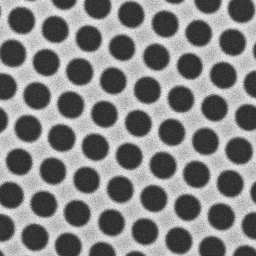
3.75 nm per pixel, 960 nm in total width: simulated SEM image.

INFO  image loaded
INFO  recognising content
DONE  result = a regular array of holes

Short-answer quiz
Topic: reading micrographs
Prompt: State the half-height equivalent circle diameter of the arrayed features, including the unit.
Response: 27.1 px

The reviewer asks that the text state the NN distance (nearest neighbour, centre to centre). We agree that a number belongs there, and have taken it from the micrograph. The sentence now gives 0.128 um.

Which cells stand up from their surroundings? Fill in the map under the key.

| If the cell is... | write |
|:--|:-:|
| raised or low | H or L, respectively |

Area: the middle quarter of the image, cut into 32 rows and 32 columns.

HLLLLLLHHHHHHHHHHHHHHLLLLLHHLLLL
LLLLLLLHHHLLLLHHHHHHHHLLHHHHLLLL
HLLLLLLHHLLLLLLHHHHHHHHHHHHHHLLL
HLLLLLLHHLLLLLLLHHHLLLHHHHHHHHLL
HHLLLLHHHLLLLLLLHHLLLLLLHHHHHHHH
HHHHHHHHHLLLLLLHHHLLLLLLHHHHLLHH
HHHHHHHHHHLLLLLHHLLLLLLLHHHLLLLL
LLLLHHHHHHHLLHHHHHLLLLLLHHLLLLLL
LLLLLHHHHHHHHHHHHHLLLLLLHHLLLLLL
LLLLLHHHLLLLHHHHHHHLLLLHHHLLLLLL
LLLLLHHLLLLLLHHHHHHHHHHHHHLLLLLL
LLLLLHHLLLLLLHHHHHLHHHHHHHHLLLLH
LLLLHHHLLLLLLLHHLLLLLHHHHHHHHHHH
HLLHHHHLLLLLLHHLLLLLLLHHHHHHHHHH
HHHHHHHLLLLLLHHLLLLLLLHHHLLLLHHH
LHHHHHHHHLLLHHHLLLLLLLHHLLLLLLHH
LLHHHHHHHHHHHHHHLLLLLLHHLLLLLLHH
LLLHHHHLLHHHHHHHHLLLLHHHLLLLLLHH
LLLHHLLLLLHHHHHHHHHHHHHHLLLLLLHH
LLLHHLLLLLLHHHHHHHHHHHHHHLLLLHHH
LLHHLLLLLLLHHHLLLLHHHHHHHHLLHHHH
LHHHLLLLLLLHHLLLLLLHHHHHHHHHHHHH
HHHHHLLLLLLHHLLLLLLLHHHLLLHHHHHH
HHHHHHLLLLHHHLLLLLLLHHLLLLLLHHHH
HHHHHHHHHHHHHLLLLLLHHLLLLLLLHHHH
HHHHHHHHHHHHHHLLLLLHHLLLLLLLHHLL
LHHLLLLLHHHHHHHHLHHHHHLLLLLLHHLL
LHHLLLLLLHHHHHHHHHHHHHLLLLLLHHLL
HHLLLLLLLHHHLLLLHHHHHHHLLLHHHHLL
HHLLLLLLLHHLLLLLLHHHHHHHHHHHHHLL
HHHLLLLLLHHLLLLLLHHHHLLLHHHHHHHH
HHHLLLLLHHHLLLLLLHHHLLLLLHHHHHHH